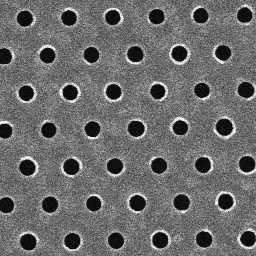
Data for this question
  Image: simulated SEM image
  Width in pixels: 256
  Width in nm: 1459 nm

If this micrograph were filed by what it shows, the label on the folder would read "a regular array of holes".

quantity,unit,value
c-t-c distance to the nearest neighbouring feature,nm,245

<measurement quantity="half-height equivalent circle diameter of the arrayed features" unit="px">15.4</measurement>